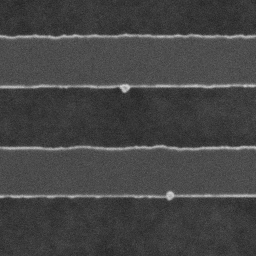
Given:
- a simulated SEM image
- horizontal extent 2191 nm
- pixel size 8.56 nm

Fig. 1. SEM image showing lines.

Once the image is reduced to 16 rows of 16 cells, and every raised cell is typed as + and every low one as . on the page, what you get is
................
................
++++++++++++++++
++++++++++++++++
++++++++++++++++
.......+........
................
................
................
++++++++++++++++
++++++++++++++++
++++++++++++++++
................
................
................
................